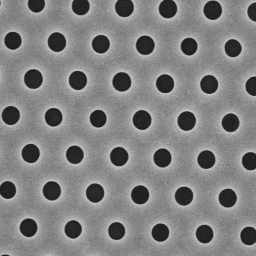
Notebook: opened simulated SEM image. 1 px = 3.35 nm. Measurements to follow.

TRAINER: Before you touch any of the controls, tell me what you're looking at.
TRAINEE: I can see a regular array of holes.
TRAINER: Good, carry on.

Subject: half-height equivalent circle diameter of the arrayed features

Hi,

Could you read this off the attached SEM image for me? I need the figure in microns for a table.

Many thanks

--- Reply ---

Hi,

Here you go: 0.0617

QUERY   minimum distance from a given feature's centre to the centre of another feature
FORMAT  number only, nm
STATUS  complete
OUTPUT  144